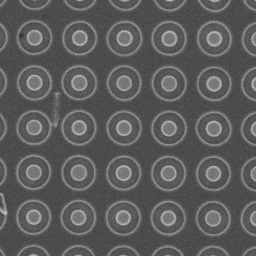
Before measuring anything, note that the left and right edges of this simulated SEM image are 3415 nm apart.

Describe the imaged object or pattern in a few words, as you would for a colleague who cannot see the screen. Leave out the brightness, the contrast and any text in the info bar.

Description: an array of small figures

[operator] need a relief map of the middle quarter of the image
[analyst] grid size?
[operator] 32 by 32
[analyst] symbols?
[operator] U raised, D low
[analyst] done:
UUUUUUUUUUUUUUUUUUUUUUUUUUUUUUUU
UDDDDDUUUUUUUDDDDDUUUUUUDDDDDUUU
DDDDDDDUUUUUDDDDDDUUUUUDDDDDDDUU
DDDUUDDDUUUDDDUUDDDUUUDDDUUUDDUU
DDUUUUDDUUUDDUUUUDDUUUDDUUUUDDUU
DDUUUDDDUUUDDUUUUDDUUUDDDUUUDDUU
DDDDDDDUUUUUDDUUDDDUUUUDDUUDDDUU
UDDDDDDUUUUUDDDDDDUUUUUDDDDDDUUU
UUUDDUUUUUUUUDDDDUUUUUUUDDDDUUUU
UUUUUUUUUUUUUUUUUUUUUUUUUUUUUUUU
UUUUUUUUUUUUUUUUUUUUUUUUUUUUUUUU
UUUUUUUUUUUUUUUUUUUUUUUUUUUUUUUU
UUDDDDUUUUUUUDDDDUUUUUUUUDDDUUUU
UDDDDDDUUUUUDDDDDDUUUUUDDDDDDUUU
DDDUUDDDUUUDDDUUDDDUUUUDDUUDDDUU
DDUUUDDDUUUDDUUUUDDUUUDDDUUUDDUU
DDUUUDDDUUUDDUUUUDDUUUDDDUUUDDUU
DDDUDDDUUUUDDDUUDDDUUUUDDUUDDDUU
UDDDDDDUUUUUDDDDDDUUUUUDDDDDDUUU
UUDDDDUUUUUUUDDDDUUUUUUUDDDDDUUU
UUUUUUUUUUUUUUUUUUUUUUUUUUUUUUUU
UUUUUUUUUUUUUUUUUUUUUUUUUUUUUUUU
UUUUUUUUUUUUUUUUUUUUUUUUUUUUUUUU
UUDDDUUUUUUUUUDDUUUUUUUUUDDUUUUU
UDDDDDDUUUUUDDDDDDUUUUUDDDDDDUUU
DDDUUDDUUUUDDDDDDDDUUUUDDDDDDDUU
DDUUUDDDUUUDDUUUUDDUUUDDDUUUDDUU
DDUUUDDDUUUDDUUUUDDUUUDDUUUUDDUU
DDUUUDDUUUUDDDUUDDDUUUDDDUUUDDUU
DDDDDDDUUUUUDDDDDDUUUUUDDDDDDDUU
UDDDDDUUUUUUDDDDDUUUUUUUDDDDDUUU
UUUUUUUUUUUUUUUUUUUUUUUUUUUUUUUU